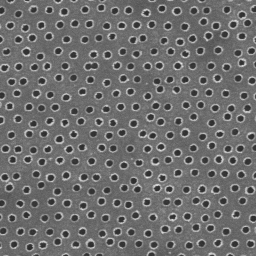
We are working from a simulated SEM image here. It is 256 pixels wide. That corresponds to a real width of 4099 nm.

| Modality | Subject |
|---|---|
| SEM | a regular array of holes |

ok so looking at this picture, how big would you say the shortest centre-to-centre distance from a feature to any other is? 214 nanometers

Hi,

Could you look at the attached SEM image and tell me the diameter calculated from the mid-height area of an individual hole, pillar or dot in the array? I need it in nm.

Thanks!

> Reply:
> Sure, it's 108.